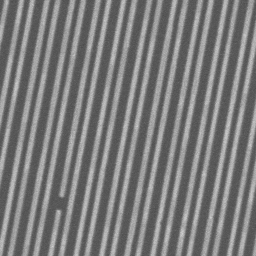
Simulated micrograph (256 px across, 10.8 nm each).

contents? parallel lines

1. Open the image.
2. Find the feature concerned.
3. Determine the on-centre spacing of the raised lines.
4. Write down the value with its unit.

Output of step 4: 0.136 µm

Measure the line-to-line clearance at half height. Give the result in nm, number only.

84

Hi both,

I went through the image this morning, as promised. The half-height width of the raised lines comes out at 52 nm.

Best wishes